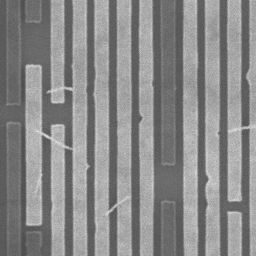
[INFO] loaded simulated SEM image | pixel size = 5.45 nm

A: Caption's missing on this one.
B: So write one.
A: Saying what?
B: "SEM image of parallel lines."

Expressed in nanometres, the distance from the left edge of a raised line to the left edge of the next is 120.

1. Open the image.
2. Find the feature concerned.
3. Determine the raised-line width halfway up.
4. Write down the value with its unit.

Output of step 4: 0.0702 µm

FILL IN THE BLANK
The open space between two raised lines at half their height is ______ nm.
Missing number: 48.4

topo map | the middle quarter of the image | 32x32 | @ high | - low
--@@@---@@@---@@@--@@@--@@@@--@@
--@@@---@@@--@@@@--@@@--@@@@--@@
--@@@---@@@--@@@@--@@@--@@@@--@@
--@@@---@@@--@@@@--@@@--@@@@--@@
---@@---@@@--@@@@--@@@--@@@@--@@
---@@---@@@--@@@@--@@@--@@@@--@@
-@@@@---@@@--@@@@--@@@--@@@@--@@
---@@---@@@--@@@@--@@@---@@---@@
---@@---@@@--@@@@--@@@---@@---@@
---@@---@@@---@@@--@@@---@@---@@
---@@---@@@---@@@--@@@---@@---@@
---@@---@@@---@@@--@@@---@@---@@
---@@---@@@---@@@--@@@---@@---@@
---@@---@@@---@@@---@@---@@---@@
---@@---@@@---@@@--@@@---@@@--@@
---@@---@@@---@@@--@@@---@@@--@@
---@@---@@@---@@@--@@@---@@@--@@
---@@---@@@---@@@--@@@---@@@--@@
---@@---@@@---@@@--@@@---@@@--@@
---@@---@@@---@@@--@@@---@@---@@
---@@@--@@@---@@@--@@@---@@---@@
---@@@--@@@---@@@--@@@---@@---@@
---@@@--@@@---@@@--@@@---@@---@@
---@@@--@@@---@@@--@@@---@@---@@
---@@@--@@@---@@@--@@@---@@@--@@
---@@@--@@@---@@@--@@@--------@@
---@@@--@@@---@@@--@@@--------@@
---@@@--@@@--@@@@--@@@--------@@
---@@@--@@@--@@@@--@@@--------@@
---@@@--@@@--@@@@--@@@--------@@
---@@@--@@@--@@@@--@@@--------@@
---@@@--@@@--@@@@--@@@--------@@